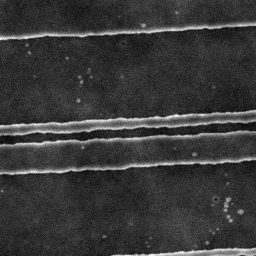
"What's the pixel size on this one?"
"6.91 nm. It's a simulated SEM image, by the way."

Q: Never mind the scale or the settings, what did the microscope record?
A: lines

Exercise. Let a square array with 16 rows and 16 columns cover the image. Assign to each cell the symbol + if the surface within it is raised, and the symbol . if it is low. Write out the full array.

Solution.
++++++++++++++++
++++++++++++++++
................
................
................
................
................
......++++++++++
++++++++++++++++
++++++++++++++++
++++++++........
................
................
................
................
................